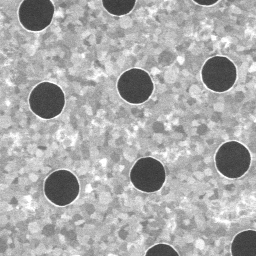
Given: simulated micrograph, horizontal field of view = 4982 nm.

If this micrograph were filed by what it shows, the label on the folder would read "holes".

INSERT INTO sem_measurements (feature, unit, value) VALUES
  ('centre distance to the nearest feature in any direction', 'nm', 1680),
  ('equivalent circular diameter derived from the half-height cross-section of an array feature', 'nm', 699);